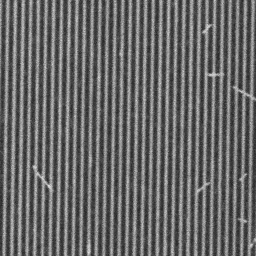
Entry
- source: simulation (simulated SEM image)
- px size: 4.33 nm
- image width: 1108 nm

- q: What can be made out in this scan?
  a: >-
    parallel lines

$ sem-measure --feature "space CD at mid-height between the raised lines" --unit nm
22.2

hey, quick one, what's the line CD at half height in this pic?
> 10.8 nm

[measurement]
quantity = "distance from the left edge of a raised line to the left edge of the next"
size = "0.0332 microns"